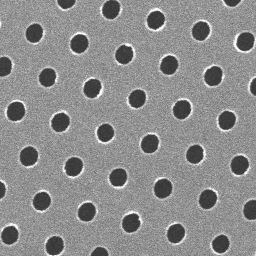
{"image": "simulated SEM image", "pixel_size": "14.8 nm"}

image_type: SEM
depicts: a regular array of holes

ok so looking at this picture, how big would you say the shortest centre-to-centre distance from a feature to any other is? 0.677 micrometres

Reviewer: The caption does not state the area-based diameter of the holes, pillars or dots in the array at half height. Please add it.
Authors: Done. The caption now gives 281 nm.